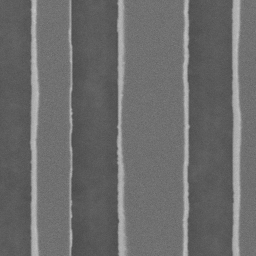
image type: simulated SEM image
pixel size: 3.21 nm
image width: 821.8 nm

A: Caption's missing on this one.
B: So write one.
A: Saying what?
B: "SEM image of lines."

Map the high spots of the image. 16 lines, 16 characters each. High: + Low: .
..++...+++++...+
..++...+++++...+
..++...+++++...+
..++...+++++...+
..++...+++++...+
..++...+++++...+
..++...+++++...+
..++...+++++...+
..++...+++++...+
..++...+++++...+
..++...+++++...+
..++...+++++...+
..++...+++++...+
..++...+++++...+
..++...+++++...+
..++....++++...+